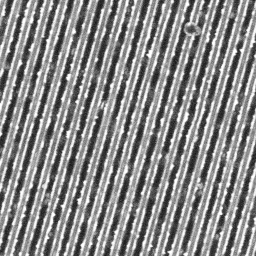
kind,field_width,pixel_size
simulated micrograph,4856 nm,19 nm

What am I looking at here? parallel lines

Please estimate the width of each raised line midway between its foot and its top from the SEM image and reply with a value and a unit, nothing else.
190 nanometers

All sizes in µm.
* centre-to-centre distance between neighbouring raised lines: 0.276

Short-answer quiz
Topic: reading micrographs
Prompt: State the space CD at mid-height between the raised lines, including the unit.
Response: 89.1 nm